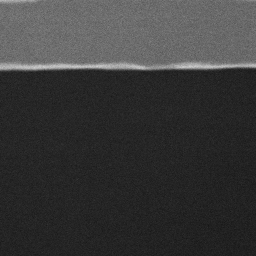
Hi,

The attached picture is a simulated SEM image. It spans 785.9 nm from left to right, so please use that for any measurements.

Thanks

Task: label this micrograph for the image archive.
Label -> wiring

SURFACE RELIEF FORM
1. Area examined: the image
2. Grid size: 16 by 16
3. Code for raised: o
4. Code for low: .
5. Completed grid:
oooooooooooooooo
oooooooooooooooo
oooooooooooooooo
oooooooooooooooo
................
................
................
................
................
................
................
................
................
................
................
................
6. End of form